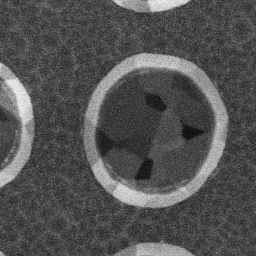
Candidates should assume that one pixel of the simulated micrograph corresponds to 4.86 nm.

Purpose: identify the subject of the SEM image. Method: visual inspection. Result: raised bodies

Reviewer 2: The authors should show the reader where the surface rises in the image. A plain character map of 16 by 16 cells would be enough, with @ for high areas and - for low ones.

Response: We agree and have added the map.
----------------
----------------
----------------
----------------
-------@@@@@----
@-----@@@@@@@---
@@----@@@@@@@@--
@@----@@@@@@@@--
@@----@@@@@@@@--
@@----@@@@@@@@--
@-----@@@@@@@---
-------@@@@@----
---------@------
----------------
----------------
----------------